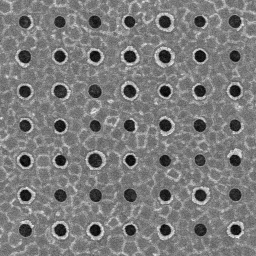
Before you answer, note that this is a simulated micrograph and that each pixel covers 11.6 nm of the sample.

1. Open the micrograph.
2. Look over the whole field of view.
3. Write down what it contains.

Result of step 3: a regular array of holes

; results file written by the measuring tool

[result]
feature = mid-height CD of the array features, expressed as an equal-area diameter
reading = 139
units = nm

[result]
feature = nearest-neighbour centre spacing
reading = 400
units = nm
